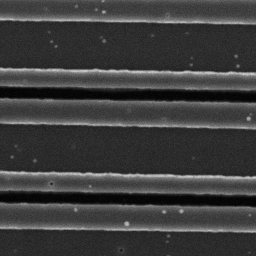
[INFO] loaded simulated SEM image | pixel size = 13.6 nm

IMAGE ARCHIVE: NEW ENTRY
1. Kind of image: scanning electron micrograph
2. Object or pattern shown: lines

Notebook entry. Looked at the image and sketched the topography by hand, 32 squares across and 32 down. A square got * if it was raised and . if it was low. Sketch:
********************************
********************************
.......*.***********************
................................
................................
................................
................................
................................
................................
********************************
********************************
................................
********........................
********************************
********************************
.........***********************
................................
................................
................................
................................
................................
**..............................
********************************
********************************
................................
****............................
********************************
********************************
********************************
................................
................................
................................